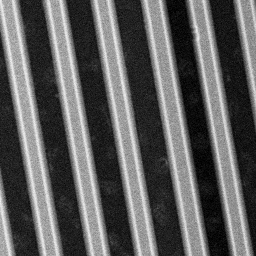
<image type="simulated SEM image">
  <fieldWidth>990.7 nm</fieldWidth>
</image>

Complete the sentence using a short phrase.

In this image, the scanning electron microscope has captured parallel lines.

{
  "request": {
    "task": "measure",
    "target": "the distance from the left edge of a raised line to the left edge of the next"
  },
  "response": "0.181 µm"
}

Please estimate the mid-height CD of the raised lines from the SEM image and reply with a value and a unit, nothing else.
0.07 micrometres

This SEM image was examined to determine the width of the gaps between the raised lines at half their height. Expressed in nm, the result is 110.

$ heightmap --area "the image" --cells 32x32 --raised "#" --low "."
##....##....##....##....##....##
##....##....##....###...##....##
##....##....##....###...##....##
###...###...###...###...##....##
###...###...###....##...###...##
.##....##....##....##...###...##
.##....##....##....###...##....#
.##....##....##....###...##....#
.##....##....##....###...##....#
.###...###...###....##...##....#
..##...###...###....##...###...#
..##....##....##....##...###...#
..##....##....##....###...##....
..##....##....##....###...##....
..###...##....##....###...##....
..###...###...###....##...###...
...##...###....##....##...###...
...##....##....##....##...###...
...##....##....##....###...##...
...##....##....##....###...##...
...###...##....##....###...##...
...###...###...###....##...###..
....##....##....##....##...###..
....##....##....##....##....##..
....##....##....##....###...##..
....##....##....##....###...##..
#...###...###...###...###...##..
#....##...###...###....##...###.
#....##....##....##....##...###.
#....##....##....##....###...##.
#....##....##....##....###...##.
##...##....##....##....###...##.